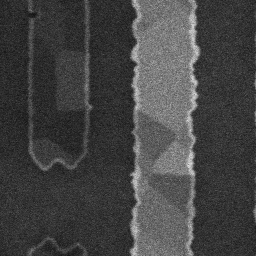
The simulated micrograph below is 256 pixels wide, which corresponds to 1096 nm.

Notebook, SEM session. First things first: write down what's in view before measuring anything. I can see one or a few lines or trenches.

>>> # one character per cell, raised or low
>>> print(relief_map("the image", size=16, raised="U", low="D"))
DDUUUDDDDUUUDDDD
DDUUUDDDUUUUDDDD
DDUUUDDDUUUUDDDD
DDUUUDDDUUUUDDDD
DDUUUDDDUUUUDDDD
DDUUUDDDUUUUDDDD
DDUUUDDDDUUUDDDD
DDUUUDDDUUUUDDDD
DDUUUDDDUUUUDDDD
DDUUUDDDDUUUDDDD
DDDDDDDDDUUUDDDD
DDDDDDDDUUUUDDDD
DDDDDDDDDUUUDDDD
DDDDDDDDUUUUDDDD
DDDDDDDDUUUUDDDD
DDUUUDDDUUUUDDDD